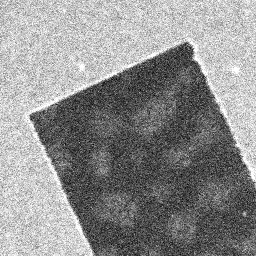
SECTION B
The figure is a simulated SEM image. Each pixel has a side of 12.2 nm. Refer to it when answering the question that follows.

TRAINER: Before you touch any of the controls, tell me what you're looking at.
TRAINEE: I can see one or a few lines or trenches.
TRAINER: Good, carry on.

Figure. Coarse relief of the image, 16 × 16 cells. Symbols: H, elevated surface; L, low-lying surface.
HHHHHHHHHHHHHHHH
HHHHHHHHHHHHHHHH
HHHHHHHHHHHHHHHH
HHHHHHHHHLLLHHHH
HHHHHHHLLLLLLHHH
HHHHHLLLLLLLLHHH
HHHLLLLLLLLLLLHH
HHLLLLLLLLLLLLHH
HHLLLLLLLLLLLLLH
HHHLLLLLLLLLLLLH
HHHLLLLLLLLLLLLL
HHHHLLLLLLLLLLLL
HHHHLLLLLLLLLLLL
HHHHHLLLLLLLLLLL
HHHHHLLLLLLLLLLL
HHHHHHLLLLLLLLLL